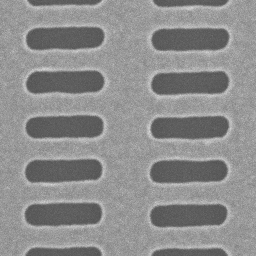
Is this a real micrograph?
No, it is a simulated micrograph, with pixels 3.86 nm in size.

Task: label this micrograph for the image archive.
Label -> a regular array of holes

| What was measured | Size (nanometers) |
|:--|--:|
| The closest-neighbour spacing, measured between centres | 169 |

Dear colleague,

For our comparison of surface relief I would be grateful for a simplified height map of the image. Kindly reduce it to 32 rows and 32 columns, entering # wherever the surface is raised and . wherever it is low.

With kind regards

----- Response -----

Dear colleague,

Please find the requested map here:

####........#######.........####
################################
################################
#####.......#########.....######
###..........######..........###
###..........######.........####
################################
################################
################################
####.........######..........###
###..........######..........###
####........#######.........####
################################
################################
#####...#...#############...####
###..........######..........###
###..........######.........####
################################
################################
################################
###..........######.........####
###..........######.........####
###.........#######.........####
################################
################################
####........##########.....#####
###..........######.........####
###..........######.........####
################################
################################
################################
###..........######.........####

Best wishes